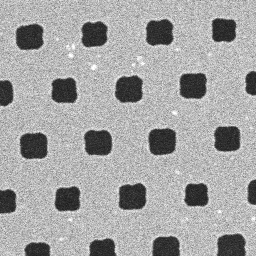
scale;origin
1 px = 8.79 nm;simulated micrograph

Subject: a regular array of holes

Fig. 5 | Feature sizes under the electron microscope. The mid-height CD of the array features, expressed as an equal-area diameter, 251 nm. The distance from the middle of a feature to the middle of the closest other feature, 63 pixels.